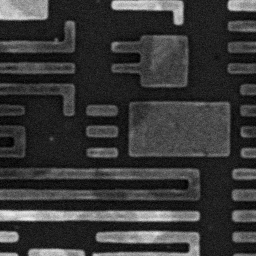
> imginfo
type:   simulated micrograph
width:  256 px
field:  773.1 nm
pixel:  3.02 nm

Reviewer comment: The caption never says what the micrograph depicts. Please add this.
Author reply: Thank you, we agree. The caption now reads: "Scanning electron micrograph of wiring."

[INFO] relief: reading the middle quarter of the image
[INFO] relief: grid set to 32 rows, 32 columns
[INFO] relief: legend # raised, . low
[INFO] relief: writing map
###.........###################.
###.........###################.
...................############.
...................############.
...................############.
##..................##########..
###.............................
###.............................
##..............................
##..............................
##..............################
##....#######...################
##....#######...################
................################
................############.###
................############.###
......#######...############.###
......#######...################
................################
................################
................################
......#######...################
......#######...################
................................
................................
................................
###...##########################
################################
################################
...............................#
...............................#
...............................#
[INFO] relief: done